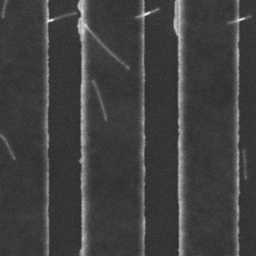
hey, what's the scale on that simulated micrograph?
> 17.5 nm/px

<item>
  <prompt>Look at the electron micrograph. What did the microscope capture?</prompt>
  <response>lines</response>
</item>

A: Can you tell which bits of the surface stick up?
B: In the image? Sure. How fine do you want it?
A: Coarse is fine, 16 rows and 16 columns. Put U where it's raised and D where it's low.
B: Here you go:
UUUDDUUUUDDUUUUD
UUUDDUUUUDDUUUUD
UUUDDUUUUDDUUUUD
UUUDDUUUUDDUUUUD
UUUDDUUUUDDUUUUD
UUUDDUUUUDDUUUUD
UUUDDUUUUDDUUUUD
UUUDDUUUUDDUUUUD
UUUDDUUUUDDUUUUD
UUUDDUUUUDDUUUUD
UUUDDUUUUDDUUUUD
UUUDDUUUUDDUUUUD
UUUDDUUUUDDUUUUD
UUUDDUUUUDDUUUUD
UUUDDUUUUDDUUUUD
UUUDDUUUUDDUUUUD